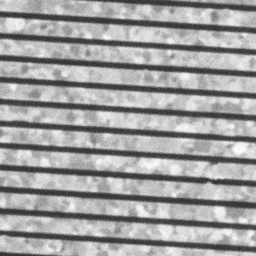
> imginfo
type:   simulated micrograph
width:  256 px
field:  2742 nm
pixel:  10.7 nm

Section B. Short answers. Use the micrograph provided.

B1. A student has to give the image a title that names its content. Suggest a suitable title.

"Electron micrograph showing parallel lines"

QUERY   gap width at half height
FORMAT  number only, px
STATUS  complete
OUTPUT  6.86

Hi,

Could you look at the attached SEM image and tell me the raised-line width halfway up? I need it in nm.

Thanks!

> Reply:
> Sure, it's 155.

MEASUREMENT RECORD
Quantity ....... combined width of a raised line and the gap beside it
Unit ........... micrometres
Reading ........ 0.234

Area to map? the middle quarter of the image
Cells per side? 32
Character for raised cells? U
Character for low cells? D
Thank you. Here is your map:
UUDDDDDDDDDDDDDDDDDDDDDDDDDDDDDU
UUUUUUUUUUUUUUDDDDDDDDDDDDDDDDDD
UUUUUUUUUUUUUUUUUUUUUUUUUUUUUUUU
UUUUUUUUUUUUUUUUUUUUUUUUUUUUUUUU
DDDDDDDUUUUUUUUUUUUUUUUUUUUUUUUU
DDDDDDDDDDDDDDDDDDDDDDUUUUUUUUUU
UUUUUUUUDDDDDDDDDDDDDDDDDDDDDDDD
UUUUUUUUUUUUUUUUUUUUUUUUDDDDDDDD
UUUUUUUUUUUUUUUUUUUUUUUUUUUUUUUU
DDUUUUUUUUUUUUUUUUUUUUUUUUUUUUUU
DDDDDDDDDDDDDDDDDUUUUUUUUUUUUUUU
DDDDDDDDDDDDDDDDDDDDDDDDDDDDDDDD
UUUUUUUUUUUUUUUDDDDDDDDDDDDDDDDD
UUUUUUUUUUUUUUUUUUUUUUUUUUUUUUUD
UUUUUUUUUUUUUUUUUUUUUUUUUUUUUUUU
DDDDDDDDDUUUUUUUUUUUUUUUUUUUUUUU
DDDDDDDDDDDDDDDDDDDDDDDDUUUUUUUU
UUUUUUUUUUDDDDDDDDDDDDDDDDDDDDDD
UUUUUUUUUUUUUUUUUUUUUUUUUUDDDDDD
UUUUUUUUUUUUUUUUUUUUUUUUUUUUUUUU
DDDDUUUUUUUUUUUUUUUUUUUUUUUUUUUU
DDDDDDDDDDDDDDDDUUUUUUUUUUUUUUUU
UDDDDDDDDDDDDDDDDDDDDDDDDDDDDDDD
UUUUUUUUUUUUUUUUUDDDDDDDDDDDDDDD
UUUUUUUUUUUUUUUUUUUUUUUUUUUUUUUU
UUUUUUUUUUUUUUUUUUUUUUUUUUUUUUUU
DDDDDDDDDDUUUUUUUUUUUUUUUUUUUUUU
DDDDDDDDDDDDDDDDDDDDDDDDDDUUUUUU
UUUUUUUUDDDDDDDDDDDDDDDDDDDDDDDD
UUUUUUUUUUUUUUUUUUUUUUUUDDDDDDDD
UUUUUUUUUUUUUUUUUUUUUUUUUUUUUUUU
DUUUUUUUUUUUUUUUUUUUUUUUUUUUUUUU